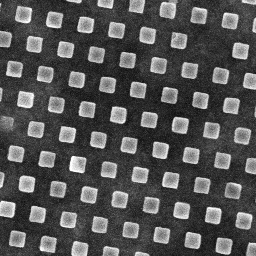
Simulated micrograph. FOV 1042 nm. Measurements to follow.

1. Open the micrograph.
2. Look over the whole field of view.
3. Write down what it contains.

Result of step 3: a regular array of raised bodies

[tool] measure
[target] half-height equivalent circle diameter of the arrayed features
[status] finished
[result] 68.1 nanometers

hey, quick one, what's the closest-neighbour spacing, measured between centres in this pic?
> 128 nanometers